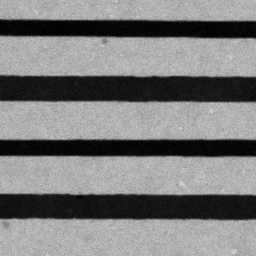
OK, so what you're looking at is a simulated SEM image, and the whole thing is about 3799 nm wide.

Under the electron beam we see lines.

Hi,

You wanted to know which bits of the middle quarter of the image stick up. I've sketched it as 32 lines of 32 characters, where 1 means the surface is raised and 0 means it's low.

11111111111111111111111111111111
11111111111111111111111111111111
11111111111111111111111111111111
00000000000000000000000000000000
00000000000000000000000000000000
00000000000000000000000000000000
00000000000000000000000000000000
00000000000000000000000000000000
00000000000000000000000000000000
11111111111110010000001100000101
11111111111111111111111111111111
11111111111111111111111111111111
11111111111111111111111111111111
11111111111111111111111111111111
11111111111111111111111111111111
11111111111111111111111111111111
11111111111111111111111111111111
11111111111111111111111111111111
11111111111111111111111111111111
00000000000000000000000000000000
00000000000000000000000000000000
00000000000000000000000000000000
00000000000000000000000000000000
11111111111111111111111111111111
11111111111111111111111111111111
11111111111111111111111111111111
11111111111111111111111111111111
11111111111111111111111111111111
11111111111111111111111111111111
11111111111111111111111111111111
11111111111111111111111111111111
11111111111111111111111111111111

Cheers